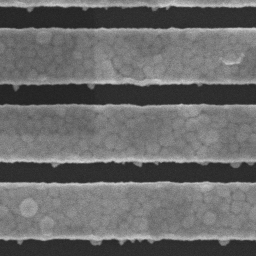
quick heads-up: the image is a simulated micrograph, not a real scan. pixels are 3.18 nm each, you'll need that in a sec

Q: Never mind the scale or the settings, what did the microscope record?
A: lines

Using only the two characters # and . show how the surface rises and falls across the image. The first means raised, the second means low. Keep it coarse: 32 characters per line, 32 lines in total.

################################
................................
................................
.....................#..........
################################
################################
################################
################################
################################
################################
########################..#####.
................................
................................
################################
################################
################################
################################
################################
################################
################################
................................
................................
................................
################################
################################
################################
################################
################################
################################
################################
................................
................................